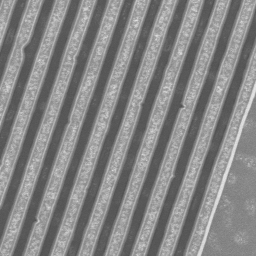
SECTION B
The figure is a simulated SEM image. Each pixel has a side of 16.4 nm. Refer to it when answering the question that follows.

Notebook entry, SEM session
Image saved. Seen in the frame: parallel lines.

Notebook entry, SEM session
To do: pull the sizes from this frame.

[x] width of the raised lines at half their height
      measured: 223 nanometers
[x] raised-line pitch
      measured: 0.417 micrometres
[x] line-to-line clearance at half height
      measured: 194 nm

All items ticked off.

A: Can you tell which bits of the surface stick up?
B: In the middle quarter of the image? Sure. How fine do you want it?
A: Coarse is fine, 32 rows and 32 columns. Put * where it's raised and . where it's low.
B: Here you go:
***...***...****...****...***...
**...****...****...****..****...
**...****...****..****...****...
**...****..****...****...***...*
*...****...****...***....***...*
*...****...***...****...****...*
*...****..****...****...***....*
...****...****...***...****...**
...****...***...****...****...**
...***...****...***....****...**
..****...****...***...****....**
..****...****...***...****...***
..***....***...****...****...***
.****...****...***...****...****
.****...***....***...****...***.
.***....***...****...***....***.
****...****...****...***...****.
****...***...****...****...***..
***....***...****...***....***..
***...****...***...****...****..
***...***...****...****...***...
**...****...****...***....***...
**...****...***...****...****...
**...***...****...****...***....
*...****...****...***....***...*
*...****...****...***...****...*
*...****...***...****...****...*
...****...****...****...***...**
...****...***....***...****...**
...***....***...****...***....**
..****...****...***....***...***
..****...***....***...****...***